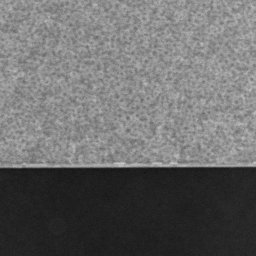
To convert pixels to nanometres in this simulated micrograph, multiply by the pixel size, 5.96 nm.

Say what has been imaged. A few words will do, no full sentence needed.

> one or a few lines or trenches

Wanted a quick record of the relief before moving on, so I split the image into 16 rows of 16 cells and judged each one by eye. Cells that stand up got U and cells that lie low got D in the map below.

UUUUUUUUUUUUUUUU
UUUUUUUUUUUUUUUU
UUUUUUUUUUUUUUUU
UUUUUUUUUUUUUUUU
UUUUUUUUUUUUUUUU
UUUUUUUUUUUUUUUU
UUUUUUUUUUUUUUUU
UUUUUUUUUUUUUUUU
UUUUUUUUUUUUUUUU
UUUUUUUUUUUUUUUU
DDDDDDDDDDDDDDDD
DDDDDDDDDDDDDDDD
DDDDDDDDDDDDDDDD
DDDDDDDDDDDDDDDD
DDDDDDDDDDDDDDDD
DDDDDDDDDDDDDDDD